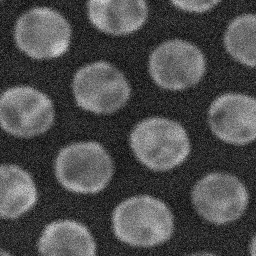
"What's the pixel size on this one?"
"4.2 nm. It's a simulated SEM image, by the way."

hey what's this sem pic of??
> raised bodies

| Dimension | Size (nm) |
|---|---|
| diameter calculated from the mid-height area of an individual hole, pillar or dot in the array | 216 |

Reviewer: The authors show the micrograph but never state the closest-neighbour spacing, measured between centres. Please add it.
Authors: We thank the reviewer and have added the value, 0.335 micrometres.